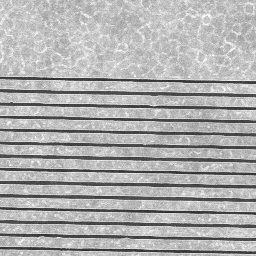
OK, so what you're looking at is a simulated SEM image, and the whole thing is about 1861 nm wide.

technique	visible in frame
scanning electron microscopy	parallel lines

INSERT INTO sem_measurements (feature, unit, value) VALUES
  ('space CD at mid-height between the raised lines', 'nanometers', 20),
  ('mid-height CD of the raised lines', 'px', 9.88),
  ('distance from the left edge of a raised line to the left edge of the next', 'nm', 95.4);